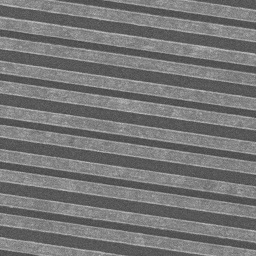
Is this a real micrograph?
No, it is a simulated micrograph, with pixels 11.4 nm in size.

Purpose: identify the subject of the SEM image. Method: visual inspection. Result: parallel lines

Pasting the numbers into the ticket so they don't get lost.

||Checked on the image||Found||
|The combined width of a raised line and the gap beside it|248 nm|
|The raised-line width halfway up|127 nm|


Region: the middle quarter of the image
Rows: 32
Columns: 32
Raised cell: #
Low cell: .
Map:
...............#################
......................##########
#####........................###
############....................
###################.............
.......###################......
..............##################
######...............###########
############................####
.##################.............
........##################......
...............#################
.....................###########
#####.......................####
############....................
##################..............
.......##################.......
..............##################
#####................###########
############...............#####
.##################.............
.......###################......
..............##################
.....................###########
#####.......................####
###########.....................
##################..............
.......##################.......
.............###################
#####...............############
############...............#####
##################..............